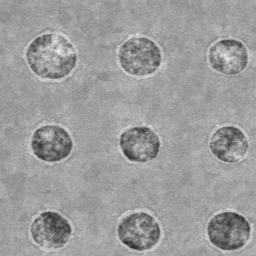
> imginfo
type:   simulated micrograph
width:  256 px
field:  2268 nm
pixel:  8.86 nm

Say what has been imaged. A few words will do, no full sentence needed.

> a regular array of holes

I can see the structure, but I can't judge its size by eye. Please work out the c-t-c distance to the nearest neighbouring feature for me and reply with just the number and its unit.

770 nm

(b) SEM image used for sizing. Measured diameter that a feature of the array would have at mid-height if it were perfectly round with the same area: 0.352 um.